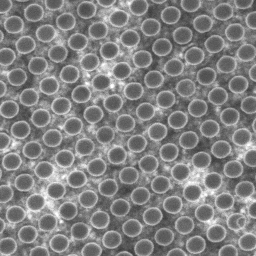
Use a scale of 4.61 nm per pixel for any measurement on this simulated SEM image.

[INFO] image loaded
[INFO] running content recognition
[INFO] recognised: a regular array of raised bodies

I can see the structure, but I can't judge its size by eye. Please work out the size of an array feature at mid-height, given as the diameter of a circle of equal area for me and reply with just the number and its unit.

0.0835 µm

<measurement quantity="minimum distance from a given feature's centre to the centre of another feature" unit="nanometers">107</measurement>